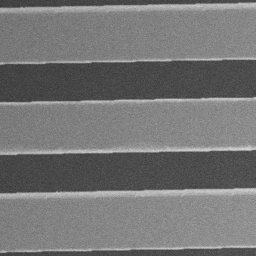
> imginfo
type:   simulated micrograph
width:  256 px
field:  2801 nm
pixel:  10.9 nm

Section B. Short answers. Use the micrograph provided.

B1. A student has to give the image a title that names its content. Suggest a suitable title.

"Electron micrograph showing lines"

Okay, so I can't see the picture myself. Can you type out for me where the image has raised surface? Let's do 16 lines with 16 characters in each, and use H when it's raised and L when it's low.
LLLLLLLLHHHHHHHH
HHHHHHHHHHHHHHHH
HHHHHHHHHHHHHHHH
HHHHHHHHHHHHHHHH
LLLLLLLLLLLLLLLL
LLLLLLLLLLLLLLLL
HHHHHHHHHHHHHHHH
HHHHHHHHHHHHHHHH
HHHHHHHHHHHHHHHH
HHHHHLLLLLLLLLLL
LLLLLLLLLLLLLLLL
LLLLLLLLLLLLLLLL
HHHHHHHHHHHHHHHH
HHHHHHHHHHHHHHHH
HHHHHHHHHHHHHHHH
HHHHHHHHHHHLLLLL